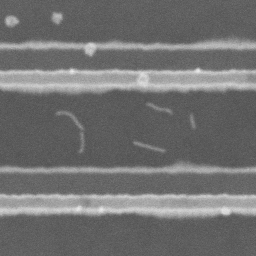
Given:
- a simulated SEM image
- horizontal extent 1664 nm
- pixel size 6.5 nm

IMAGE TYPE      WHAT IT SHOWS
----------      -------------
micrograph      lines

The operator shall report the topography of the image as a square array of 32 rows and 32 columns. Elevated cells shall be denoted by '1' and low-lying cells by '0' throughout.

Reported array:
00000000000000000000000000000000
00000000000000000000000000000000
00000000000000000000000000000000
00000000000000000000000000000000
00000000000000000000000000000000
00000000000100000000000000000000
11111111111111111111111111111111
11111111111111111111111111111111
11111111111111111111111111111111
11111111111111111111111111111111
11111111111111111111111111111111
00000000000000000000000000000000
00000000000000000000000000000000
00000000000000000000000000000000
00000000000000000000000000000000
00000000000000000000000000000000
00000000000000000000000000000000
00000000000000000000000000000000
00000000000000000000000000000000
00000000000000000000000000000000
00000000000000000000000000000000
11111111111111111111111111111111
11111111111111111111111111111111
11111111111111111111111111111111
11111111111111111111111111111111
11111111111111111111111111111111
00000000000000000000000000001000
00000000000000000000000000000000
00000000000000000000000000000000
00000000000000000000000000000000
00000000000000000000000000000000
00000000000000000000000000000000